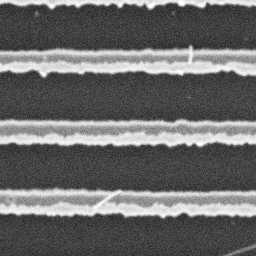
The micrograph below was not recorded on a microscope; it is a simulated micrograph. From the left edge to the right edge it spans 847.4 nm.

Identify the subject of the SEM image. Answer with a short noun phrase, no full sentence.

lines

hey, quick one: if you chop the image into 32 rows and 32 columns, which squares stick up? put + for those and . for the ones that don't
..+++++++++.+++++++++.+.++.+.+++
................................
................................
................................
................................
................................
+.++..+++....+++++++.+++.++++.+.
++++++++++++++++++++++++++++++++
++++++++++++++++++++++++++++++++
................................
................................
................................
................................
................................
................................
++++++++++++++++++++++++++++++++
++++++++++++++++++++++++++++++++
++++++++++++++++++++++++++++++++
................................
................................
................................
................................
................................
................................
++++++++++++++++++++++++++++++++
++++++++++++++++++++++++++++++++
++++++++++++++++++++++++++++++++
................................
................................
................................
................................
................................